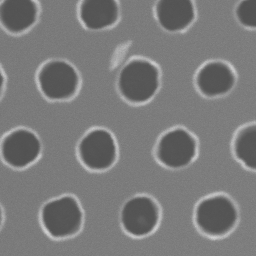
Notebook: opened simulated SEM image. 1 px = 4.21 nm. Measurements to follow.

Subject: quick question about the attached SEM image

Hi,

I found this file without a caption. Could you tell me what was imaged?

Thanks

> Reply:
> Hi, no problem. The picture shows a regular array of holes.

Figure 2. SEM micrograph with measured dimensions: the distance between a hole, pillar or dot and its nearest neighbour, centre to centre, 325 nm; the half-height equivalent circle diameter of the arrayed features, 155 nanometres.